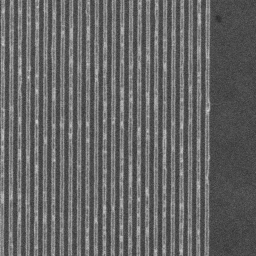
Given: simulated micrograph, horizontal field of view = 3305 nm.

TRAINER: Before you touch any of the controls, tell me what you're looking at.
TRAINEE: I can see parallel lines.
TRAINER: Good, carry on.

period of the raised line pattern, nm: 110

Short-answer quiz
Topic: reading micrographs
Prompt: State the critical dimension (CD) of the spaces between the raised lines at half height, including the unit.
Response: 72.6 nm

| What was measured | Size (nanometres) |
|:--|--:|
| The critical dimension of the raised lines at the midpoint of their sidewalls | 40.4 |